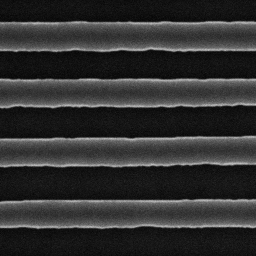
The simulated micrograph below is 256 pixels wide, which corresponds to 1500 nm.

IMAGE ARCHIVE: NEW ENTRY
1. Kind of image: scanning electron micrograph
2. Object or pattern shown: lines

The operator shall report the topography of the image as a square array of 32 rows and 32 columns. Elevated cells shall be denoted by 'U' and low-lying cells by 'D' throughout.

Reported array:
DDDDDDDDDDDDDDDDDDDDDDDDDDDDDDDD
DDDDDDDDDDDDDDDDDDDDDDDDDDDDDDDD
DDDDDDDDDDDDDDDDDDDDDDDDDDDDDDDD
UUUUUUUUUUUUUUUUUUUUUUUUUUUUUUUU
UUUUUUUUUUUUUUUUUUUUUUUUUUUUUUUU
UUUUUUUUUUUUUUUUUUUUUUUUUUUUUUUU
DDDDDDDDDDDDDDDDDDDDDDDDDDDDDDDD
DDDDDDDDDDDDDDDDDDDDDDDDDDDDDDDD
DDDDDDDDDDDDDDDDDDDDDDDDDDDDDDDD
DDDDDDDDDDDDDDDDDDDDDDDDDDDDDDDD
UUUUUUUUUUUUUUUUUUUUUUUUUUUUUUUU
UUUUUUUUUUUUUUUUUUUUUUUUUUUUUUUU
UUUUUUUUUUUUUUUUUUUUUUUUUUUUUUUU
DDDDDDDDDDDDDDDDDDDDDDDDDDDDDDDD
DDDDDDDDDDDDDDDDDDDDDDDDDDDDDDDD
DDDDDDDDDDDDDDDDDDDDDDDDDDDDDDDD
DDDDDDDDDDDDDDDDDDDDDDDDDDDDDDDD
UUUUUUUUUUUUUUUUUUUUUUUUUUUUUUUU
UUUUUUUUUUUUUUUUUUUUUUUUUUUUUUUU
UUUUUUUUUUUUUUUUUUUUUUUUUUUUUUUU
UUUUUUUUUUUUUUUUUUUUUUUUUUUUUUUU
DDDDDDDDDDDDDDDDDDDDDDDDDDDDDDDD
DDDDDDDDDDDDDDDDDDDDDDDDDDDDDDDD
DDDDDDDDDDDDDDDDDDDDDDDDDDDDDDDD
DDDDDDDDDDDDDDDDDDDDDDDDDDDDDDDD
UUUUUUUUUUUUUUUUUUUUUUUUUUUUUUUU
UUUUUUUUUUUUUUUUUUUUUUUUUUUUUUUU
UUUUUUUUUUUUUUUUUUUUUUUUUUUUUUUU
DDDDUDDDDDDDUUDDDDDDDDDDDDDDDDDD
DDDDDDDDDDDDDDDDDDDDDDDDDDDDDDDD
DDDDDDDDDDDDDDDDDDDDDDDDDDDDDDDD
DDDDDDDDDDDDDDDDDDDDDDDDDDDDDDDD